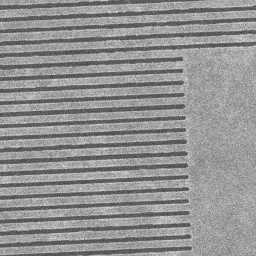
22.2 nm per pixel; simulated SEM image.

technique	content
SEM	parallel lines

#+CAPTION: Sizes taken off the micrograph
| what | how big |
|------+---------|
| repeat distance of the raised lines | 0.264 microns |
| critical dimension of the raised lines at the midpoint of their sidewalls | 0.144 micrometres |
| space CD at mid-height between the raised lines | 122 nanometres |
